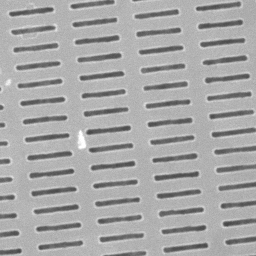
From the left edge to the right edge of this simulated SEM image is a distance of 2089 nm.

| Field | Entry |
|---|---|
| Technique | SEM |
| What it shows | a regular array of holes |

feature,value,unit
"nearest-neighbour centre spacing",0.147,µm